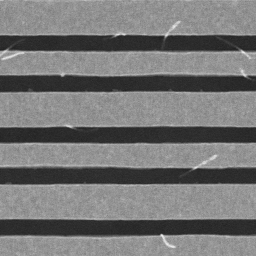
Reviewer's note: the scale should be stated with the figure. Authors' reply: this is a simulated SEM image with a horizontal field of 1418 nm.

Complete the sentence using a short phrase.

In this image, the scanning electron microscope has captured lines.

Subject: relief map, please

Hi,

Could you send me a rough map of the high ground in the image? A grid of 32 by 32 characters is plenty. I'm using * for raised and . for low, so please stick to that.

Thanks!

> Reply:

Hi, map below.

********************************
********************************
********************************
********************************
................................
................................
********************************
********************************
********************************
...........*****..............*.
................................
.............................***
********************************
********************************
********************************
********************************
................................
................................
********************************
********************************
********************************
................................
................................
********************************
********************************
********************************
********************************
................................
................................
...*................*********...
********************************
********************************